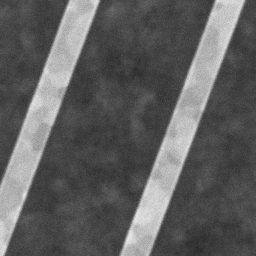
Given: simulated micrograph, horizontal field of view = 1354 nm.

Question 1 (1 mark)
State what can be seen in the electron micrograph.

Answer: one or a few lines or trenches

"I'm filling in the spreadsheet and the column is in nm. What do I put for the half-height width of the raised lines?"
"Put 134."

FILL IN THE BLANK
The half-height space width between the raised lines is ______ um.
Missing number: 0.587